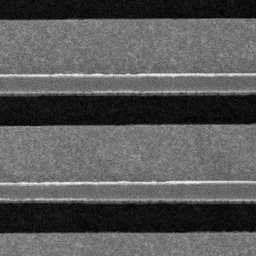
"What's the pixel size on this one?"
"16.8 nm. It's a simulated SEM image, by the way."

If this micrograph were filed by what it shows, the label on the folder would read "lines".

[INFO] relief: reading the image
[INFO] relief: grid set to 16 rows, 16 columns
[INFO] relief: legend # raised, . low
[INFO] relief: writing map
................
################
################
################
################
################
................
................
################
################
################
################
################
................
................
################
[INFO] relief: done